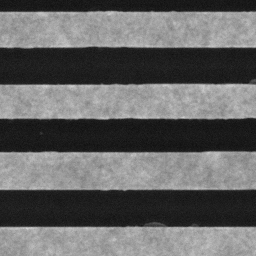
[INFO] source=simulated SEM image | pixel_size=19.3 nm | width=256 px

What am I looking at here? lines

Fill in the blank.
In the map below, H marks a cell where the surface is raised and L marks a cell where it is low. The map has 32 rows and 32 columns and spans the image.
LLLLLLLLLLLLLLLLLLLLLLLLLLLLLLLL
LLLLLLLLLLLHHHHLLLHLLHLLLLLLLLHL
HHHHHHHHHHHHHHHHHHHHHHHHHHHHHHHH
HHHHHHHHHHHHHHHHHHHHHHHHHHHHHHHH
HHHHHHHHHHHHHHHHHHHHHHHHHHHHHHHH
HHHHHHHHHHHHHHHHHHHHHHHHHHHHHHHH
LLLLLLLLLLLLLLLLLLLLLLLLLLLLLLLL
LLLLLLLLLLLLLLLLLLLLLLLLLLLLLLLL
LLLLLLLLLLLLLLLLLLLLLLLLLLLLLLLL
LLLLLLLLLLLLLLLLLLLLLLLLLLLLLLLL
LLLLLLLLLLLLLLLLLLLLLLLLLLLLLLLL
HHHHHHHHHHHHHHHHHHHHHHHHHHHHHHHH
HHHHHHHHHHHHHHHHHHHHHHHHHHHHHHHH
HHHHHHHHHHHHHHHHHHHHHHHHHHHHHHHH
HHHHHHHHHHHHHHHHHHHHHHHHHHHHHHHH
LLLLLLLLLLLLLLLLLLLLLLLLLLLLLLLL
LLLLLLLLLLLLLLLLLLLLLLLLLLLLLLLL
LLLLLLLLLLLLLLLLLLLLLLLLLLLLLLLL
LLLLLLLLLLLLLLLLLLLLLLLLLLLLLLLL
HHHHHHHHHHHHHHHHHHHHHHHHHHHHHHHH
HHHHHHHHHHHHHHHHHHHHHHHHHHHHHHHH
HHHHHHHHHHHHHHHHHHHHHHHHHHHHHHHH
HHHHHHHHHHHHHHHHHHHHHHHHHHHHHHHH
HHHHHHHHHHHHHHHHHHHHHHHHHHHHHHHH
LLLLLLLLLLLLLLLLLLLLLLLLLLLLLLLL
LLLLLLLLLLLLLLLLLLLLLLLLLLLLLLLL
LLLLLLLLLLLLLLLLLLLLLLLLLLLLLLLL
LLLLLLLLLLLLLLLLLLLLLLLLLLLLLLLL
HHHHHHHHHHHHHHHHHHHHHHHHHHHHHHHH
HHHHHHHHHHHHHHHHHHHHHHHHHHHHHHHH
HHHHHHHHHHHHHHHHHHHHHHHHHHHHHHHH
HHHHHHHHHHHHHHHHHHHHHHHHHHHHHHHH